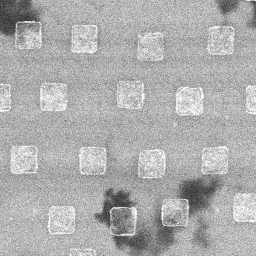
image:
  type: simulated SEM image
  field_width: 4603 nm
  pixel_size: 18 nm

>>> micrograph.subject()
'a regular array of raised bodies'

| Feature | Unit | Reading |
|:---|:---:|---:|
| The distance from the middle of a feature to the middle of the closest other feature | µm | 1.03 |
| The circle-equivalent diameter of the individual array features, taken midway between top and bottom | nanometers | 512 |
